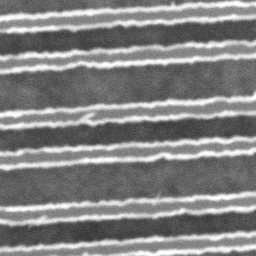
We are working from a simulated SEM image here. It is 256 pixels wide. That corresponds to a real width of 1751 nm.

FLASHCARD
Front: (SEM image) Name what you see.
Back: parallel lines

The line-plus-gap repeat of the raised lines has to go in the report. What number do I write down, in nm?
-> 322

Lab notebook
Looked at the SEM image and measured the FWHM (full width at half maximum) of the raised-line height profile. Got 104 nm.